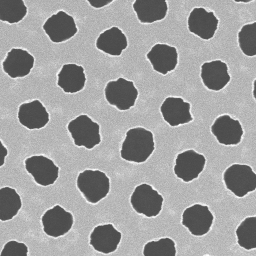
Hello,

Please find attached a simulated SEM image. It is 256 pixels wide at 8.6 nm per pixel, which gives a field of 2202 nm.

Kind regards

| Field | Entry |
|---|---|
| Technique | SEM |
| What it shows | a regular array of holes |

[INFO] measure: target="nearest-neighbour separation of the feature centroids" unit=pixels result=52.6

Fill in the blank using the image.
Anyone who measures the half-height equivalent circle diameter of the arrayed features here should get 257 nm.